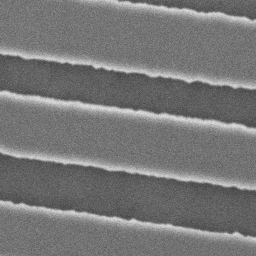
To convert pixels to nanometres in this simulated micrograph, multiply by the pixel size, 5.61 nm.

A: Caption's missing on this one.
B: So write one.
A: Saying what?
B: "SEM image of lines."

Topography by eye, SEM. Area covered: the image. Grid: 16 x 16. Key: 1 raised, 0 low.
1111111111100000
1111111111111111
1111111111111111
0111111111111111
0000000011111111
0000000000000001
1111100000000000
1111111111111000
1111111111111111
1111111111111111
0000001111111111
0000000000000111
0000000000000000
1111110000000000
1111111111111000
1111111111111111